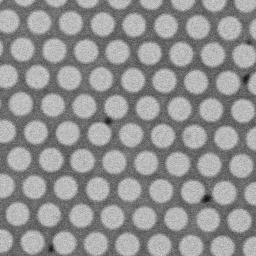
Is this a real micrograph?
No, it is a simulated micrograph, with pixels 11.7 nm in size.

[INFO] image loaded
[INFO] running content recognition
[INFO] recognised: an array of small figures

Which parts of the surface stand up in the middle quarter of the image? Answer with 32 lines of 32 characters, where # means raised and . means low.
................................
###.....###.....###.....##......
####...#####...#####...#####...#
####..######..######..######..##
####..######..######..######..##
###....#####...#####..######..##
........##......###....####....#
................................
...####....####....###..........
...#####..######..#####....####.
..######..######..######..######
..######..######..######..######
...####....####...#####...#####.
............##.....###.....####.
................................
###....####....####....###......
####..#####...#####...#####...##
####..######..######..######..##
####..######..#####...######..##
###....####...#####...#####...##
................##.....###.....#
....##..........................
..#####...#####....###.....###..
..#####...#####...#####...#####.
..#####...#####...#####...#####.
..#####...#####...#####...#####.
...###....#####...#####...#####.
....................#......###..
##......#.......................
###...#####...####....####.....#
###...#####...#####...#####...##
###...#####...#####..######..###